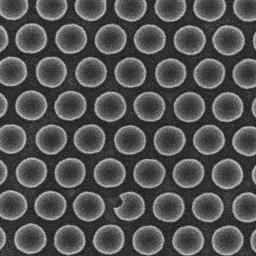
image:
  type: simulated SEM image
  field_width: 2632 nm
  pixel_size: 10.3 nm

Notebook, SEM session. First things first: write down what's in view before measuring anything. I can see a regular array of raised bodies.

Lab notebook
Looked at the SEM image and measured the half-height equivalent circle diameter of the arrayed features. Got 303 nm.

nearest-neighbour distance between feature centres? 395 nanometres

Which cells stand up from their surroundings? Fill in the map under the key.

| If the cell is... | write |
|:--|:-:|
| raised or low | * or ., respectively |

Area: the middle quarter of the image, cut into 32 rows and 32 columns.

....******...*******....******..
...*******...*******...*******..
...*******...*******...*******..
...*******...*******...*******..
....******....******....*****...
......**........**.......***....
................................
****......***.......***.......**
*****....******...******....****
*****...*******...*******...****
*****...*******...*******...****
*****...*******...*******...****
*****...*******...*******...****
***......*****.....*****.....***
................................
......**........*...............
....*****.....*****.....*****...
...*******...*******...*******..
...*******...*******...*******..
...*******...*******...*******..
...*******...*******...*******..
....*****.....*****....******...
.........................**.....
................................
****.....*****.....*****.....***
*****...*******...*******...****
*****...*******...*******..*****
*****...*******...*******..*****
*****...*******...*******..*****
****....******....******....****
***.......**........***......***
................................